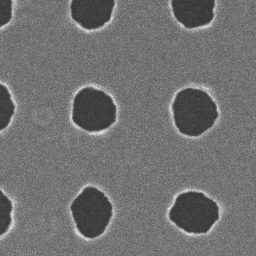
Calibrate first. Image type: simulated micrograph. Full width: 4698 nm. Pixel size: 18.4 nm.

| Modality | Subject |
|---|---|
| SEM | holes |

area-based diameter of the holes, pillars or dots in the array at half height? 44.7 pixels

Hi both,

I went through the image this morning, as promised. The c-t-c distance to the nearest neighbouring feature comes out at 1840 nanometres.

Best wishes